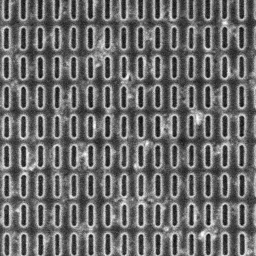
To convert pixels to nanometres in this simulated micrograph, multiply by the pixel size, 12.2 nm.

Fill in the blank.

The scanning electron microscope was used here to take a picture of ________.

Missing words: a regular array of holes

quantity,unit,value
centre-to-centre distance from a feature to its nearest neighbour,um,0.206